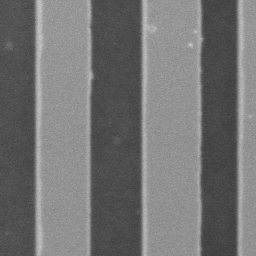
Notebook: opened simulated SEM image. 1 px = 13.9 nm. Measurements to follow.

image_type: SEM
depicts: lines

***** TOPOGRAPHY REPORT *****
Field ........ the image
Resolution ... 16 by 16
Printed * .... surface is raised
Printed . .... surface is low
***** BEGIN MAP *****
..****...****..*
..****...****..*
..****...****..*
..****...****..*
..****...***...*
..****...***...*
..****...****..*
..****...****..*
..****...****..*
..****...****..*
..****...****..*
..****...***...*
..****...****..*
..****...****..*
..****...****..*
..****...***...*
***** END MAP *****